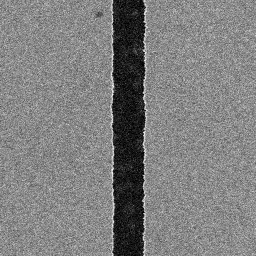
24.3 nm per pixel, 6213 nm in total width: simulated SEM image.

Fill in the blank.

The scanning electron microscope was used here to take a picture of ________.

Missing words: one or a few lines or trenches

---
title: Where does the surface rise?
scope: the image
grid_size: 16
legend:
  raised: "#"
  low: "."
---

#######..#######
#######..#######
#######..#######
#######..#######
#######..#######
#######..#######
#######..#######
#######..#######
#######..#######
#######..#######
#######..#######
#######..#######
#######..#######
#######..#######
#######..#######
#######..#######